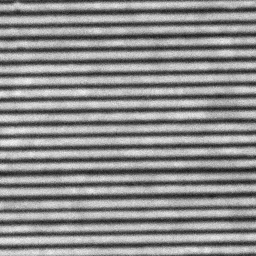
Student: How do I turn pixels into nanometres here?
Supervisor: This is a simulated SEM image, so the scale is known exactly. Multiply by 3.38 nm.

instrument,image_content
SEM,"parallel lines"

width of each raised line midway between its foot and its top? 0.0203 um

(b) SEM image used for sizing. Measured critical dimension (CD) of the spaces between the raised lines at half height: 23.2 nanometres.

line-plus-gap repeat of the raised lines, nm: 41.5